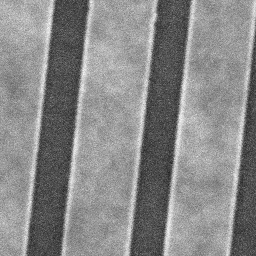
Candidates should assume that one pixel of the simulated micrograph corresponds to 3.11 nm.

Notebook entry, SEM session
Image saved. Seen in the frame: one or a few lines or trenches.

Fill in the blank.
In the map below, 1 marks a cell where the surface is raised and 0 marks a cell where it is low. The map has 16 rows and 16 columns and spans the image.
1110001111001111
1110011111001111
1110011110001111
1110011110001111
1110011110001111
1110011110011110
1110011110011110
1110011110011110
1100011110011110
1100011110011110
1100111110011110
1100111100011110
1100111100011110
1100111100011110
1100111100111100
1100111100111100